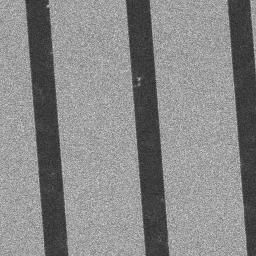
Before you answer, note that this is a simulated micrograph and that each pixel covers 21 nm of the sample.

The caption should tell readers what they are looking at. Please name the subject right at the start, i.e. one or a few lines or trenches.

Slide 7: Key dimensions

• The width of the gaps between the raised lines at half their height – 75.7 px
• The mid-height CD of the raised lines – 522 nanometers